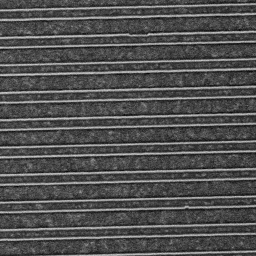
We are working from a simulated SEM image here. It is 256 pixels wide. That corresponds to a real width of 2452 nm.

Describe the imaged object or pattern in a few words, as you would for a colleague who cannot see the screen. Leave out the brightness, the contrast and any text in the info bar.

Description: parallel lines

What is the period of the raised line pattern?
0.263 um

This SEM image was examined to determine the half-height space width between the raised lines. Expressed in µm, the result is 0.17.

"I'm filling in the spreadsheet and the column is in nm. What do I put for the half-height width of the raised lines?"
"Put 89.8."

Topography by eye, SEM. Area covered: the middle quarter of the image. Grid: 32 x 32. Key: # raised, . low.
################################
################################
................................
................................
................................
................................
...............#################
################################
#############################...
................................
................................
................................
................................
......##########################
################################
####################............
................................
................................
................................
................................
......##########################
################################
####################............
................................
................................
................................
................................
################################
################################
###########.....................
................................
................................